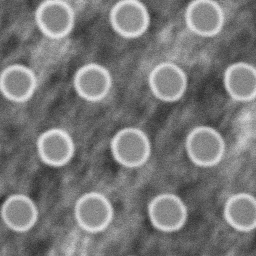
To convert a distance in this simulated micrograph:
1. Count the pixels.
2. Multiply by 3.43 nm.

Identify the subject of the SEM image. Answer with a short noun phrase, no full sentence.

a regular array of raised bodies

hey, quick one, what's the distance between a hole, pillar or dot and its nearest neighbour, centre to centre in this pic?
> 255 nanometers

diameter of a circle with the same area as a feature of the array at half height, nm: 120